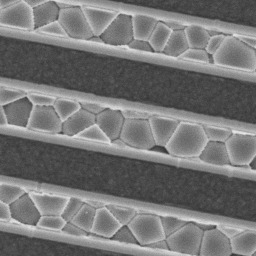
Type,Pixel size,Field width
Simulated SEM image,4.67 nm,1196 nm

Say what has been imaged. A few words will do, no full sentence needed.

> one or a few lines or trenches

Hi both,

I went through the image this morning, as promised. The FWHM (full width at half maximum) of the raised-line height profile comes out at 211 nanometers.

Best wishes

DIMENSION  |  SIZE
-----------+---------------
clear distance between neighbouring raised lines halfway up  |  232 nanometres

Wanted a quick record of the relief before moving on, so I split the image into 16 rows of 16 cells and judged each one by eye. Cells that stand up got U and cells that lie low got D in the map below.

UUUUUUUUDDDDDDDD
UUUUUUUUUUUUUDDD
DDDUUUUUUUUUUUUU
DDDDDDDDDUUUUUUU
DDDDDDDDDDDDDDUU
UUDDDDDDDDDDDDDD
UUUUUUUUDDDDDDDD
UUUUUUUUUUUUUDDD
DDUUUUUUUUUUUUUU
DDDDDDDDUUUUUUUU
DDDDDDDDDDDDDUUU
UDDDDDDDDDDDDDDD
UUUUUUUDDDDDDDDD
UUUUUUUUUUUUDDDD
DDUUUUUUUUUUUUUU
DDDDDDDDUUUUUUUU